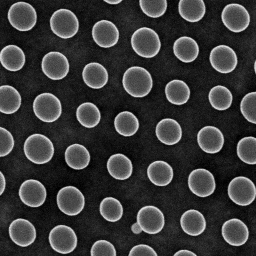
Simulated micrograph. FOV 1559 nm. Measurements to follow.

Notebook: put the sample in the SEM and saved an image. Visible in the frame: a regular array of raised bodies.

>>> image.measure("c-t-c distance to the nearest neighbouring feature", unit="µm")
0.245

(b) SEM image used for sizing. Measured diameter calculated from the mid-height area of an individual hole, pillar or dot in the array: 162 nanometres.